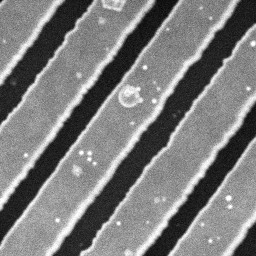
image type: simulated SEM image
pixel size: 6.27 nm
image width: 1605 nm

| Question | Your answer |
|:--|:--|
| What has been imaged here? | lines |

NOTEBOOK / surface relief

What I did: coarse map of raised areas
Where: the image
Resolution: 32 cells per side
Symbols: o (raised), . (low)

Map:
oooooooo...oooooooo...oooooooo..
ooooooo....ooooooo...oooooooo...
oooooo....oooooooo...ooooooo....
ooooo....oooooooo...oooooooo...o
ooooo...oooooooo...oooooooo....o
oooo....ooooooo....ooooooo....oo
ooo....oooooooo...ooooooo....ooo
ooo...oooooooo...oooooooo...oooo
oo....ooooooo...oooooooo...ooooo
o....ooooooo....ooooooo....ooooo
....oooooooo...ooooooo....oooooo
...oooooooo...oooooooo...ooooooo
...ooooooo...oooooooo....ooooooo
..ooooooo...oooooooo....ooooooo.
.oooooooo...oooooooo...oooooooo.
oooooooo...oooooooo...oooooooo..
ooooooo...oooooooo....ooooooo...
ooooooo...ooooooo....oooooooo...
oooooo...oooooooo....ooooooo...o
ooooo...oooooooo...oooooooo...oo
oooo...oooooooo....ooooooo....oo
ooo....ooooooo....oooooooo...ooo
ooo...oooooooo...oooooooo...oooo
oo...oooooooo...oooooooo...ooooo
o....ooooooo....oooooooo...ooooo
o...ooooooo....oooooooo...oooooo
...oooooooo...oooooooo...ooooooo
..oooooooo....ooooooo...oooooooo
.oooooooo....oooooooo...ooooooo.
.ooooooo....oooooooo...oooooooo.
oooooooo...oooooooo...oooooooo..
ooooooo...oooooooo...oooooooo...